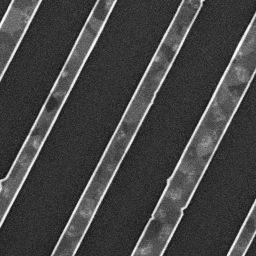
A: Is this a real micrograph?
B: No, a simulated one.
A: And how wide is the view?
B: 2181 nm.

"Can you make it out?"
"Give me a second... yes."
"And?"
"one or a few lines or trenches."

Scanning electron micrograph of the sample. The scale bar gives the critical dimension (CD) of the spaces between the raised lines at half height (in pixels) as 52.8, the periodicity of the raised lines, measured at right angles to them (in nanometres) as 645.